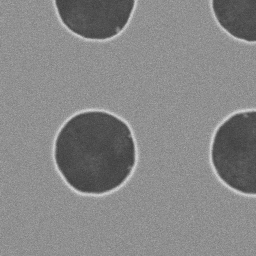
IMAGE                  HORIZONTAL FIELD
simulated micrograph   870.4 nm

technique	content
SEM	holes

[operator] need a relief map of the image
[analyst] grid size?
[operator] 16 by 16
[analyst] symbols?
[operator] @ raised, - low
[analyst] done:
@@@@----@@@@@---
@@@@----@@@@@@--
@@@@@@@@@@@@@@@-
@@@@@@@@@@@@@@@@
@@@@@@@@@@@@@@@@
@@@@@@@@@@@@@@@@
@@@@@@@@@@@@@@@@
@@@@----@@@@@@--
@@@@----@@@@@---
@@@-----@@@@@---
@@@@----@@@@@---
@@@@----@@@@@@--
@@@@@@@@@@@@@@@@
@@@@@@@@@@@@@@@@
@@@@@@@@@@@@@@@@
@@@@@@@@@@@@@@@@